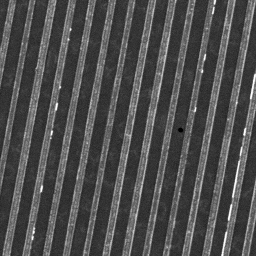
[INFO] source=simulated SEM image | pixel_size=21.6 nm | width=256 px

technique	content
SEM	parallel lines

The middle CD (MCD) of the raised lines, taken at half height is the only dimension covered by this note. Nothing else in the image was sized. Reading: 136 nanometers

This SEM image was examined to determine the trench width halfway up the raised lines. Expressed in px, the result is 13.5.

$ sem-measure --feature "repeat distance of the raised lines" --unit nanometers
424